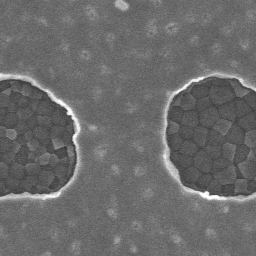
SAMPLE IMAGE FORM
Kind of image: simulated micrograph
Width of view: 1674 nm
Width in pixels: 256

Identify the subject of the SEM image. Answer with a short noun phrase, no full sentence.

holes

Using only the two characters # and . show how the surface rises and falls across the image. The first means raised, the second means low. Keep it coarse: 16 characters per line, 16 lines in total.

################
################
################
################
################
..##########....
....#######.....
.....#####......
.....#####......
.....#####......
.....######.....
....#######.....
################
################
################
################